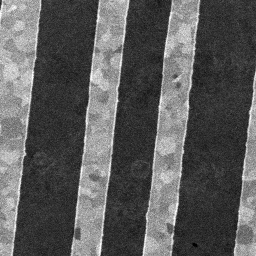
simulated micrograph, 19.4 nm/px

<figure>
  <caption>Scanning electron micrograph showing one or a few lines or trenches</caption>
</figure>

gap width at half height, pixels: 58.3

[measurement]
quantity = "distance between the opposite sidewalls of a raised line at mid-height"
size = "541 nm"